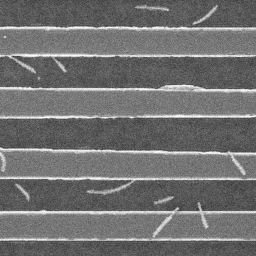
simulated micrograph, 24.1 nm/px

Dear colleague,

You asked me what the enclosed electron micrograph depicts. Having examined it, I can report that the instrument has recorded lines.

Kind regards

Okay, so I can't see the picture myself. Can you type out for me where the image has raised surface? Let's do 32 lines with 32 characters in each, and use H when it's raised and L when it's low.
LLLLLLLLLLLLLLLLLLLLLLLLLLLLLLLL
LLLLLLLLLLLLLLLLLLLLLLLLLLLLLLLL
LLLLLLLLLLLLLLLLLLLLLLLLLLLLLLLL
HHHHHHLLLHHHHHHHLLLLLLLLLLLLLLLL
HHHHHHHHHHHHHHHHHHHHHHHHHHHHHHHH
HHHHHHHHHHHHHHHHHHHHHHHHHHHHHHHH
HHHHHHHHHHHHHHHHHHHHHHHHHHHHHHHH
LLLLLLLLLLLLLLLLLLLLLLLLLLLLLLLL
LLLLLLLLLLLLLLLLLLLLLLLLLLLLLLLL
LLLLLLLLLLLLLLLLLLLLLLLLLLLLLLLL
LLLLLLLLLLLLLLLLLLLLLLLLLLLLLLLL
HHHHHHHHHHHHHHHHHHHHHHHHHHHHHHHH
HHHHHHHHHHHHHHHHHHHHHHHHHHHHHHHH
HHHHHHHHHHHHHHHHHHHHHHHHHHHHHHHH
HHHHHHHHHHHHHHHHHHHHHHLHHHHHHHHL
LLLLLLLLLLLLLLLLLLLLLLLLLLLLLLLL
LLLLLLLLLLLLLLLLLLLLLLLLLLLLLLLL
LLLLLLLLLLLLLLLLLLLLLLLLLLLLLLLL
LLLLLLLLLLLLLLLLLLLLLLLLLLLLLLLL
HHHHHHHHHHHHHHHHHHHHHHHHHHHHHHHH
HHHHHHHHHHHHHHHHHHHHHHHHHHHHHHHH
HHHHHHHHHHHHHHHHHHHHHHHHHHHHHHHH
LLLLLLLLLLLLLLLLLLLLLLLLLLLLLLLL
LLLLLLLLLLLLLLLLLLLLLLLLLLLLLLLL
LLLLLLLLLLLLLLLLLLLLLLLLLLLLLLLL
LLLLLLLLLLLLLLLLLLLLLLLLLLLLLLLL
HHHHHHHHHHHHHHHHHHHHHHHHHHHHHHHH
HHHHHHHHHHHHHHHHHHHHHHHHHHHHHHHH
HHHHHHHHHHHHHHHHHHHHHHHHHHHHHHHH
HHHHHHHHHHHHHHHHHHHHHHHHHHHHHHHH
LLLLLLLLLLLLLLLLLLLLLLLLLLLLLLLL
LLLLLLLLLLLLLLLLLLLLLLLLLLLLLLLL